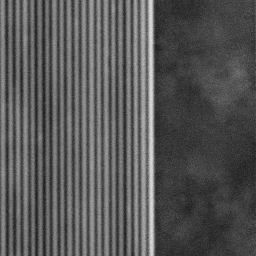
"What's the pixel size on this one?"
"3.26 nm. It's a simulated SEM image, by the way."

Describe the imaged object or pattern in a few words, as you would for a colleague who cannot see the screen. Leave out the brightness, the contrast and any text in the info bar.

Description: parallel lines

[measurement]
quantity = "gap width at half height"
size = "6.5 nanometers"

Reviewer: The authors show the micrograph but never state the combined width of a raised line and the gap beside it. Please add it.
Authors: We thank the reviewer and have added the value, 24 nanometers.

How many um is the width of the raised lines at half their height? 0.0188